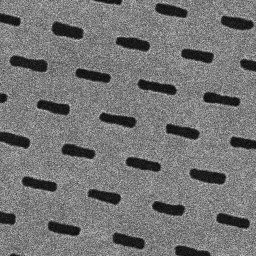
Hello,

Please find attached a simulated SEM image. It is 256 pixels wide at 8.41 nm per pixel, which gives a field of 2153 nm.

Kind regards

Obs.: a regular array of holes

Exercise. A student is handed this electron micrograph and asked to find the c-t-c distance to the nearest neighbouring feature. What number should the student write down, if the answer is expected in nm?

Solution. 422